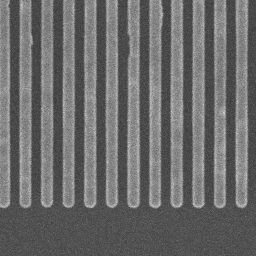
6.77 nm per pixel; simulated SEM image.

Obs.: parallel lines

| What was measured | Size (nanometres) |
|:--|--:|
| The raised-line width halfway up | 77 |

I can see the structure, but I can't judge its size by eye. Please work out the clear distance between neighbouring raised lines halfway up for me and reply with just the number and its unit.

70.2 nanometres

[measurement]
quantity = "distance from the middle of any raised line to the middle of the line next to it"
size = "146 nanometers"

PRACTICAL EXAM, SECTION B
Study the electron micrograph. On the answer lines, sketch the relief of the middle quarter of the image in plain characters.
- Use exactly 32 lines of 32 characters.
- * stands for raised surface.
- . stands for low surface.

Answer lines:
**...***...**...***...**...***..
**...***...**...***...**...***..
**...***...**...***...**...***..
**...***...**...***...**...***..
**...***...**...***...**...***..
**...***...**...***...**...***..
***..***...**...***...**...***..
***..***...**...***...**...***..
***..***...**...***...**...***..
***..***...**...***...**...***..
***..***...**...***...**...***..
***..***...**...***...**...***..
***..***...**...***...**...***..
***..***...**...***...**...***..
**...***...**...***...**...***..
**...***...**...***...**...***..
**...***...**...***...**...***..
**...***...**...***...**...***..
**...***...**...***...**...***..
**...***...**...***...**...***..
**...***...**...***...**...***..
**...***...**...***...**...***..
**...***...**...***...**...***..
**...***...**...***...**...***..
**...***...**...***...**...***..
**...***...**...***...**...***..
**...***...**...***...**...***..
**...***...**...***...**...***..
**...***...**...***...**...***..
**...***...**...***...**...***..
**...***...**...***...**...***..
**...***...**...***...**...***..